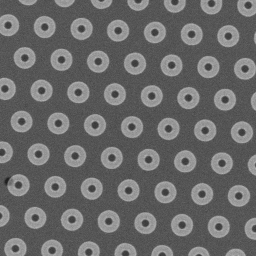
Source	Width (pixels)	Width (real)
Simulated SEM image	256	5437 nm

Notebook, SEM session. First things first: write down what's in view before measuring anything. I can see an array of small figures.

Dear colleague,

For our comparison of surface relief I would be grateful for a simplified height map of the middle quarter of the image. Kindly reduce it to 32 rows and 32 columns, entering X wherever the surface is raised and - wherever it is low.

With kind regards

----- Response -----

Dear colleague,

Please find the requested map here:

XX----XXXXX----XXXXX----XXXXX---
-------XXX------XXXX----XXXXX---
-----------------X-------XXXX---
--------------------------------
--------------------------------
-XXXXX-----XXX--------X---------
-XXXXX----XXXXX-----XXXX-----XXX
-XXXXX----XXXXX----XXXXXX----XXX
-XXXXX----XXXXX----XXXXXX---XXXX
---XX------XXXX-----XXXX-----XXX
---------------------XX------XXX
--------------------------------
--------------------------------
X-----XXXX------XX--------------
X----XXXXX-----XXXX-----XXXX----
X----XXXXX----XXXXXX----XXXXX---
X----XXXXX----XXXXXX----XXXXX---
------XXX------XXXX-----XXXX----
-------------------------XXX----
--------------------------------
--X-----------------------------
-XXXX-----XXXX------XX----------
XXXXX----XXXXX-----XXXX-----XXXX
XXXXX----XXXXXX----XXXXX----XXXX
XXXXX-----XXXX-----XXXXX----XXXX
--XX------XXXX-----XXXX-----XXXX
--------------------XX-------XXX
--------------------------------
--------------------------------
-----XXXX-----XXXX-------X------
----XXXXX-----XXXXX----XXXX-----
----XXXXX-----XXXXX----XXXXX----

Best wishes